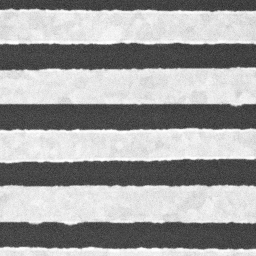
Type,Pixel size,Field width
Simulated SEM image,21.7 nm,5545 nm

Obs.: lines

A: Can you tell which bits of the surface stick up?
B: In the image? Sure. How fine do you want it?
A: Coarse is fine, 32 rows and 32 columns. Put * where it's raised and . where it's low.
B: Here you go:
................................
********************************
********************************
********************************
********************************
................................
................................
................................
................................
********************************
********************************
********************************
********************************
................................
................................
................................
********************************
********************************
********************************
********************************
................................
................................
................................
********************************
********************************
********************************
********************************
********************************
................................
................................
................................
********************************